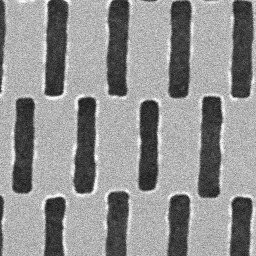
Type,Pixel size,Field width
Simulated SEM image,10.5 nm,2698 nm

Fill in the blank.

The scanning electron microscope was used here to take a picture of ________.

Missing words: holes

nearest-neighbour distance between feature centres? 652 nm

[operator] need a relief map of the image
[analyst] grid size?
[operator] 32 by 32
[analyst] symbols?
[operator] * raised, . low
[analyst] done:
.*****...*****..******..*****...
.*****...****...*****...*****...
.*****...****...*****...*****...
.*****..******..*****...*****...
.*****..******..*****...*****...
.*****..*****...*****...*****...
.*****..*****...*****...*****...
******..*****...*****...*****...
******..*****...*****...*****...
******..*****...*****...*****...
******..*****...*****...*****..*
*****...******..*****...*****..*
**..******..******.******...****
**..******..*****...*****...****
**..******..*****...*****...****
**..******..*****...*****...****
**..******..*****...*****...****
**..******..******..*****...****
**..******..*****...*****...****
**..*****...*****...*****...****
**..*****...*****...*****...****
**..*****...*****...*****...****
*...*****...*****...*****...****
**..*****...*****..******...****
*************...******..*..*****
.*****..*****...*****...*****...
******..*****...*****...*****...
******..*****...*****...*****..*
******..*****...*****...*****..*
******..*****...*****...*****..*
******..*****...*****...*****..*
*****...*****...*****...*****..*